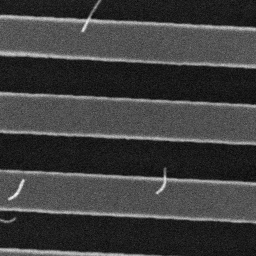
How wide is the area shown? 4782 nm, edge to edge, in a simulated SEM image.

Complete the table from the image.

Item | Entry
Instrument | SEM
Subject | lines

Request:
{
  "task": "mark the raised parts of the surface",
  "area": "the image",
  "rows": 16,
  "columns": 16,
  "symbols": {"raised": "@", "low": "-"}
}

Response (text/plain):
----------------
@@@@@@@@@@@-----
@@@@@@@@@@@@@@@@
-@@@@@@@@@@@@@@@
----------------
----------------
@@@@@@@@@@@@@@@-
@@@@@@@@@@@@@@@@
----@@@@@@@@@@@@
----------------
----------------
@@@@@@@@@@@@@@@@
@@@@@@@@@@@@@@@@
-------@@@@@@@@@
----------------
----------------